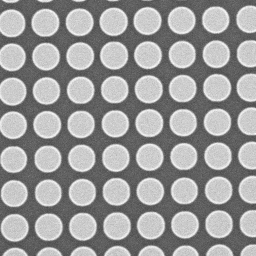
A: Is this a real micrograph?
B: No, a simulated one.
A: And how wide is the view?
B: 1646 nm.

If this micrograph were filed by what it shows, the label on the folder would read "an array of small figures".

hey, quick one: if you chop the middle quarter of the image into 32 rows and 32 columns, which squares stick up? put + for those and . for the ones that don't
..++++....+++++....++++.....+++.
................................
................................
...++......+++.....++++.....++++
..+++++...+++++...++++++...+++++
.++++++..+++++++..++++++..++++++
.+++++++..++++++..++++++..++++++
.++++++...++++++..++++++...+++++
.++++++...+++++....+++++...+++++
..++++......++......++..........
................................
....................++..........
..++++.....++++....+++++...+++++
.++++++...++++++..++++++...+++++
.++++++...++++++..+++++++..+++++
.++++++...++++++..+++++++..+++++
.++++++...++++++..++++++...+++++
..+++++....++++....++++.....+++.
................................
................................
....+......+++......+++.....++++
..+++++...++++++...+++++...+++++
.+++++++..++++++..++++++...+++++
.+++++++..++++++..+++++++..+++++
.+++++++..++++++..+++++++..+++++
..+++++...++++++...+++++....++++
...+++.....+++.......+..........
................................
.............................++.
...++++....++++....+++++....++++
..+++++...++++++..+++++++..+++++
.+++++++..++++++..+++++++..+++++